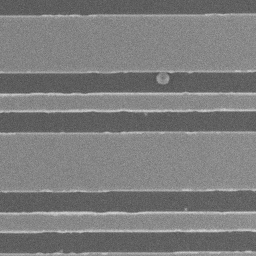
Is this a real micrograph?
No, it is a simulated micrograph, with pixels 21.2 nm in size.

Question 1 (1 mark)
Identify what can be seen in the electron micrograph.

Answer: lines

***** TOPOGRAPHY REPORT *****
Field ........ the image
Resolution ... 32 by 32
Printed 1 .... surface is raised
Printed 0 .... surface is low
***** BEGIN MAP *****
00000000000000000000000000000000
00000000000000000000000000000000
11111111111111111111111111111111
11111111111111111111111111111111
11111111111111111111111111111111
11111111111111111111111111111111
11111111111111111111111111111111
11111111111111111111111111111111
11111111111111111111111111111111
00000000000000000000000000000000
00000000000000000000000000000000
00000000000000000000000000000000
11111111111111111111111111111111
11111111111111111111111111111111
00000000000000000000000000000000
00000000000000000000000000000000
00000000000000000000000000000000
11111111111111111111111111111111
11111111111111111111111111111111
11111111111111111111111111111111
11111111111111111111111111111111
11111111111111111111111111111111
11111111111111111111111111111111
11111111111111111111111111111111
00000000000000000000000000000000
00000000000000000000000000000000
00000000000000000000000000000000
11111111111111111111111111111111
11111111111111111111111111111111
00000000000000000000000000000000
00000000000000000000000000000000
00000000000000000000000000000111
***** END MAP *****